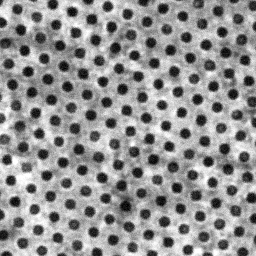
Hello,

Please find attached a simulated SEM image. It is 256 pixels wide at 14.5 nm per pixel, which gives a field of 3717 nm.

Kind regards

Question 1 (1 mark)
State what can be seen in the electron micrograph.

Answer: a regular array of holes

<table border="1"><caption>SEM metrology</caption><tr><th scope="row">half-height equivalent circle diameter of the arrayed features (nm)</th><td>185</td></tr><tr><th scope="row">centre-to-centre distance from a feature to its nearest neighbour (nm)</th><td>298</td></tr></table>